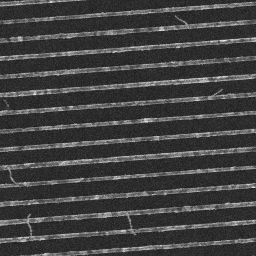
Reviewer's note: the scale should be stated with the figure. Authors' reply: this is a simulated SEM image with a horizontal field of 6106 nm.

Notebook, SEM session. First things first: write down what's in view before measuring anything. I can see parallel lines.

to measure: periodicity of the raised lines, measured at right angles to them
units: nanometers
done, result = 433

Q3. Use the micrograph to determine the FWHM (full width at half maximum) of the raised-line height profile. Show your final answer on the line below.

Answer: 86.2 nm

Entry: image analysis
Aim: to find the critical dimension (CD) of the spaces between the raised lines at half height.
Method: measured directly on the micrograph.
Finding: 339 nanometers